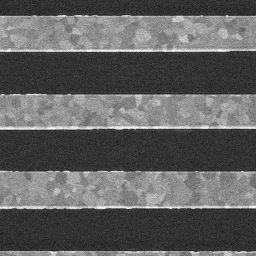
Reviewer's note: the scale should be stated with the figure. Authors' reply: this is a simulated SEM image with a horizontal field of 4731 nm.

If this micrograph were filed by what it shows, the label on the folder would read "lines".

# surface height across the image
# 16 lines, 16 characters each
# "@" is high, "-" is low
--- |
----------------
@@@@@@@@@@@@@@@@
@@@@@@@@@@@@@@@@
----------------
----------------
----------------
@@@@@@@@@@@@@@@@
@@@@@@@@@@@@@@@@
----------------
----------------
----------------
@@@@@@@@@@@@@@@@
@@@@@@@@@@@@@@@@
----------------
----------------
----------------